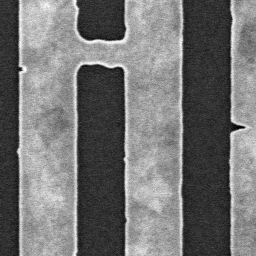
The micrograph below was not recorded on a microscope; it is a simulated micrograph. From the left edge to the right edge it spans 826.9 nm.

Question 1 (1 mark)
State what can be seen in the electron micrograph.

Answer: one or a few lines or trenches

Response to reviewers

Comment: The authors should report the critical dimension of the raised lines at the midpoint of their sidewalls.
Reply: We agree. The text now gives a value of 182 nanometres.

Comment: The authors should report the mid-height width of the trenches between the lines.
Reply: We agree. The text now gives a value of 159 nanometres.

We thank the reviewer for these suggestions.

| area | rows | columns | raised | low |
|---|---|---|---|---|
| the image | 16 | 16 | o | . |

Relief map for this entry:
.oooo...ooo...oo
.oooo...ooo....o
.oooo..oooo...oo
.oooooooooo...oo
.oooo...ooo...oo
.oooo...ooo...oo
.oooo...ooo...oo
.oooo...ooo....o
.oooo...ooo....o
.oooo...ooo...oo
.oooo...ooo...oo
.oooo...ooo...oo
.oooo...ooo...oo
.oooo...ooo...oo
.oooo...ooo...oo
.oooo...ooo...oo